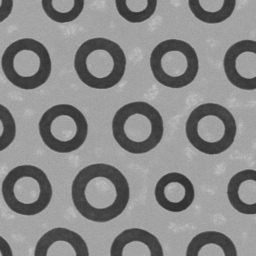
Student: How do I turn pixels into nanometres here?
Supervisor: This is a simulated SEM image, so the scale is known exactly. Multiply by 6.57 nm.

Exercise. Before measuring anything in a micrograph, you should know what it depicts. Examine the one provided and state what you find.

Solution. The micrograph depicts a regular array of ring-shaped grooves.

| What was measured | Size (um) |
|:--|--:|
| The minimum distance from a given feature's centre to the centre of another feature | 0.483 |